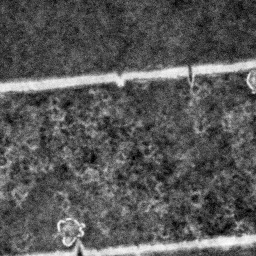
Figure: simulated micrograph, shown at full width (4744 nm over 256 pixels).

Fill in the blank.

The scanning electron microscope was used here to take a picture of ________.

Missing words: one or a few lines or trenches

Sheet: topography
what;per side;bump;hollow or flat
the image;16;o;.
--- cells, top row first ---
................
................
................
................
............oooo
oooooooooooooooo
oooooooooooooooo
oooooooooooooooo
oooooooooooooooo
oooooooooooooooo
oooooooooooooooo
oooooooooooooooo
oooooooooooooooo
oooooooooooooooo
oooooooooooooooo
ooooooooo.......